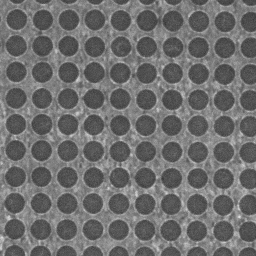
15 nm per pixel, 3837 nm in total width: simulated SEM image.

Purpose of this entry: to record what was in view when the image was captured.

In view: a regular array of holes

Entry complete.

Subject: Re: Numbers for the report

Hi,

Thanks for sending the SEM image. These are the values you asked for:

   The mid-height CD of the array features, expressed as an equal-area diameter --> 21.6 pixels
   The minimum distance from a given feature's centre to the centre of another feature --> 0.387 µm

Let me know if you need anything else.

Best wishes